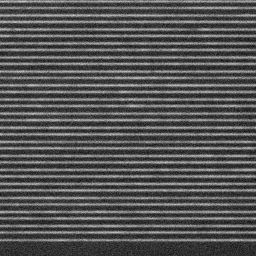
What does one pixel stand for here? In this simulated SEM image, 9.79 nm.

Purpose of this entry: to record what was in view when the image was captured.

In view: parallel lines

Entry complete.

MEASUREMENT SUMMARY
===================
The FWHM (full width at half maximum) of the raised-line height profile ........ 9.8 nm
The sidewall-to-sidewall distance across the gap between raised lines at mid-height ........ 55.7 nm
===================